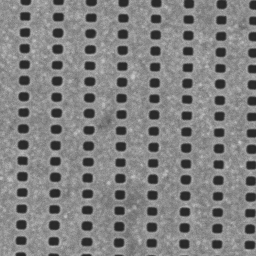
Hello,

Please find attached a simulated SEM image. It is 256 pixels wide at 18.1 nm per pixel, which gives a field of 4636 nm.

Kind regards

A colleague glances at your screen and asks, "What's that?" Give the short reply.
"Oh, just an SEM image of a regular array of holes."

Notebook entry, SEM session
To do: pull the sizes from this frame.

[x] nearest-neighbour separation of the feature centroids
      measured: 284 nanometers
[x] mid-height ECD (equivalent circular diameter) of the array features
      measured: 202 nanometers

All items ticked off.